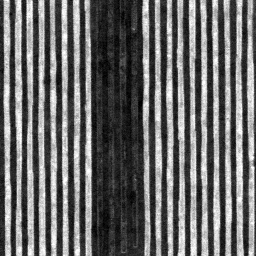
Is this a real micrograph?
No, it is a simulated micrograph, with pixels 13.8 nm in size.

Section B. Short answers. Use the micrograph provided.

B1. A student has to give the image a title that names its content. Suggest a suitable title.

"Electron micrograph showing parallel lines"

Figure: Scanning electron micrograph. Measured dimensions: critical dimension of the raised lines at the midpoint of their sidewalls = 4.87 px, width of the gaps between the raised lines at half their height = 94.7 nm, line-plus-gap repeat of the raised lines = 160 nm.